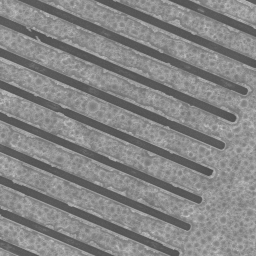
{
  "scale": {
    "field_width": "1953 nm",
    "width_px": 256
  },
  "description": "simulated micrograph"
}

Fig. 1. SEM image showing parallel lines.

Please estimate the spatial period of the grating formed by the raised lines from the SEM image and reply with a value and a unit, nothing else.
224 nm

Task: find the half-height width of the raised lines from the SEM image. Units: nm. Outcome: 159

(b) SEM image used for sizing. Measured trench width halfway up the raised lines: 8.53 px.